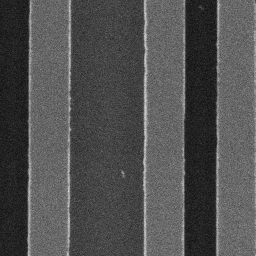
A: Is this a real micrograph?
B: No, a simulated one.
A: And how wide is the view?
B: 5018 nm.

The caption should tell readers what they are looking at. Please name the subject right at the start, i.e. lines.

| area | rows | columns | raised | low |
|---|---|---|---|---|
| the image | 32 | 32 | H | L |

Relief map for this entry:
LLLLHHHHHLLLLLLLLLHHHHHLLLLHHHHH
LLLLHHHHHLLLLLLLLLHHHHHLLLLHHHHH
LLLLHHHHHLLLLLLLLLHHHHHLLLLHHHHH
LLLLHHHHHLLLLLLLLLHHHHHLLLLHHHHH
LLLLHHHHHLLLLLLLLLHHHHHLLLLHHHHH
LLLLHHHHHLLLLLLLLLHHHHHLLLLHHHHH
LLLLHHHHHLLLLLLLLLHHHHHLLLLHHHHH
LLLLHHHHHLLLLLLLLLHHHHHLLLLHHHHH
LLLLHHHHHLLLLLLLLLHHHHHLLLLHHHHH
LLLLHHHHHLLLLLLLLLHHHHHLLLLHHHHH
LLLLHHHHHLLLLLLLLLHHHHHLLLLHHHHH
LLLLHHHHHLLLLLLLLLHHHHHLLLLHHHHH
LLLLHHHHHLLLLLLLLLHHHHHLLLLHHHHH
LLLLHHHHHLLLLLLLLLHHHHHLLLLHHHHH
LLLLHHHHHLLLLLLLLLHHHHHLLLLHHHHH
LLLLHHHHHLLLLLLLLLHHHHHLLLLHHHHH
LLLLHHHHHLLLLLLLLLHHHHHLLLLHHHHH
LLLLHHHHHLLLLLLLLLHHHHHLLLLHHHHH
LLLLHHHHHLLLLLLLLLHHHHHLLLLHHHHH
LLLLHHHHHLLLLLLLLLHHHHHLLLLHHHHH
LLLLHHHHHLLLLLLLLLHHHHHLLLLHHHHH
LLLLHHHHHLLLLLLLLLHHHHHLLLLHHHHH
LLLLHHHHHLLLLLLLLLHHHHHLLLLHHHHH
LLLLHHHHHLLLLLLLLLHHHHHLLLLHHHHH
LLLLHHHHHLLLLLLLLLHHHHHLLLLHHHHH
LLLLHHHHHLLLLLLLLLHHHHHLLLLHHHHH
LLLLHHHHHLLLLLLLLLHHHHHLLLLHHHHH
LLLLHHHHHLLLLLLLLLHHHHHLLLLHHHHH
LLLLHHHHHLLLLLLLLLHHHHHLLLLHHHHH
LLLLHHHHHLLLLLLLLLHHHHHLLLLHHHHH
LLLLHHHHHLLLLLLLLLHHHHHLLLLHHHHH
LLLLHHHHHLLLLLLLLLHHHHHLLLLHHHHH